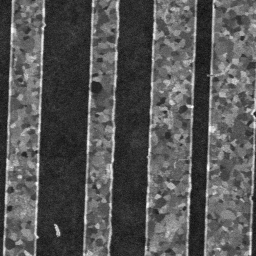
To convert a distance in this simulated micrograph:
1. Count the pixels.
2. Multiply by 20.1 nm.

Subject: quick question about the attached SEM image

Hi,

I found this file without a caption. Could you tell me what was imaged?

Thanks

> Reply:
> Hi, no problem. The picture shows one or a few lines or trenches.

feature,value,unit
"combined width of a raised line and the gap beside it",1430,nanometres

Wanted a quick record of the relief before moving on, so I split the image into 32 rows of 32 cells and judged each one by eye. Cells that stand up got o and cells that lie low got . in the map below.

..ooo.......ooo....ooooo...ooooo
..ooo.......ooo....ooooo...ooooo
..ooo.......ooo....ooooo...ooooo
..ooo.......ooo....ooooo...ooooo
..ooo.......ooo....ooooo...ooooo
.oooo......ooo.....ooooo...ooooo
.oooo......oooo....ooooo...ooooo
.oooo.......oo.....ooooo...ooooo
.oooo......ooo.....ooooo..oooooo
.oooo......ooo.....ooooo..oooooo
.oooo......ooo.....ooooo..oooooo
.oooo......ooo.....ooooo..oooooo
.oooo......ooo.....ooooo..oooooo
.oooo......ooo.....ooooo..oooooo
.oooo......ooo.....ooooo..oooooo
.oooo......ooo.....ooooo..oooooo
.oooo......ooo.....ooooo..oooooo
.oooo......ooo.....ooooo..oooooo
.oooo......ooo.....ooooo..oooooo
.oooo......ooo.....ooooo..oooooo
.oooo......ooo.....ooooo..oooooo
.oooo......ooo.....ooooo..oooooo
.oooo......ooo.....ooooo..oooooo
.oooo......ooo.....ooooo..ooooo.
.oooo......ooo....oooooo..ooooo.
.oooo......ooo....oooooo..ooooo.
.ooo.......ooo....ooooo...ooooo.
.ooo.......ooo....ooooo...ooooo.
.ooo.......ooo....ooooo...ooooo.
.oooo......ooo....ooooo...ooooo.
.ooo.......ooo....ooooo...ooooo.
.ooo.......ooo....ooooo...ooooo.